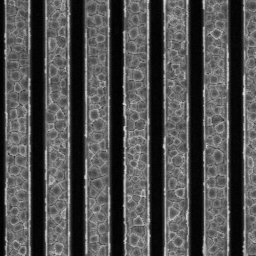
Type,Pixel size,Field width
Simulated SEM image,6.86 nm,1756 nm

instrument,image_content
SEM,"parallel lines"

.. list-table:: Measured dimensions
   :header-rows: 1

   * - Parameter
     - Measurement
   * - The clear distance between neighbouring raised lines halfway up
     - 91.7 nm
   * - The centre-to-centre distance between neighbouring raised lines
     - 272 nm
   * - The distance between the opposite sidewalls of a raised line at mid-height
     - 0.184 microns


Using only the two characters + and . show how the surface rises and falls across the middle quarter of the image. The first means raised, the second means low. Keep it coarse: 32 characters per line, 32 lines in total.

++...++++++....++++++....++++++.
++...++++++....++++++....++++++.
++...++++++....++++++....++++++.
++...++++++....++++++....++++++.
++...+++++++...++++++....++++++.
++...++++++....++++++....++++++.
++...++++++....++++++....++++++.
++...++++++....++++++....++++++.
++...++++++....++++++....++++++.
++...++++++....++++++....++++++.
++...++++++....++++++....++++++.
++...++++++....++++++....++++++.
++...++++++....++++++....++++++.
++...++++++....++++++....++++++.
++...++++++....++++++....++++++.
++...++++++....++++++....++++++.
++...++++++....++++++....++++++.
++...++++++....++++++....++++++.
++...++++++....++++++....++++++.
++...++++++....++++++....++++++.
++...++++++....++++++....++++++.
++...++++++....++++++....++++++.
++...++++++....++++++....++++++.
++...++++++....++++++....++++++.
++...++++++....++++++....++++++.
++...++++++....++++++....++++++.
++...++++++....++++++....++++++.
++...++++++....++++++....++++++.
++...++++++....++++++....++++++.
++...++++++....++++++....++++++.
++...++++++....++++++....++++++.
++...++++++....++++++....++++++.